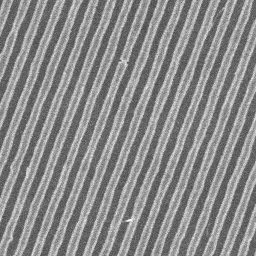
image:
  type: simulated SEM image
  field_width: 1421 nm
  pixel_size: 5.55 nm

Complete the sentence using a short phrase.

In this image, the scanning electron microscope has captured parallel lines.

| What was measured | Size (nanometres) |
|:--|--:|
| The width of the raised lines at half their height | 39.1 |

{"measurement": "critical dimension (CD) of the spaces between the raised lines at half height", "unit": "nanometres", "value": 53.4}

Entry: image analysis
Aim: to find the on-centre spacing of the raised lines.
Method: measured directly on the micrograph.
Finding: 89.7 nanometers